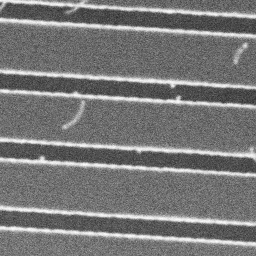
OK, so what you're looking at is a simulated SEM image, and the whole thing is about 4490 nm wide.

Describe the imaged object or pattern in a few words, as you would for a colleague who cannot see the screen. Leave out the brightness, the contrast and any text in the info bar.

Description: lines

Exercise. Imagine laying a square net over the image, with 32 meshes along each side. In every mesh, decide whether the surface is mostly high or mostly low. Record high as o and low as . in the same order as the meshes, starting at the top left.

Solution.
.......ooooooooooooooooooooooooo
.......................ooooooooo
oo..............................
oooooooooooooooooo..............
oooooooooooooooooooooooooooooooo
oooooooooooooooooooooooooooooooo
oooooooooooooooooooooooooooooooo
oooooooooooooooooooooooooooooooo
oooooooooooooooooooooooooooooooo
........oooooooooooooooooooooooo
.......................ooooooooo
ooo.............................
ooooooooooooooooooo.............
oooooooooooooooooooooooooooooooo
oooooooooooooooooooooooooooooooo
oooooooooooooooooooooooooooooooo
oooooooooooooooooooooooooooooooo
oooooooooooooooooooooooooooooooo
...............ooooooooooooooooo
...............................o
ooooooooooo.....................
ooooooooooooooooooooooooooo.....
oooooooooooooooooooooooooooooooo
oooooooooooooooooooooooooooooooo
oooooooooooooooooooooooooooooooo
oooooooooooooooooooooooooooooooo
......oooooooooooooooooooooooooo
......................oooooooooo
o...............................
ooooooooooooooooo...............
oooooooooooooooooooooooooooooooo
oooooooooooooooooooooooooooooooo